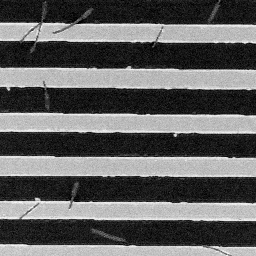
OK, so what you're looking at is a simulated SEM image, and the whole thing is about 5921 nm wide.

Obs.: lines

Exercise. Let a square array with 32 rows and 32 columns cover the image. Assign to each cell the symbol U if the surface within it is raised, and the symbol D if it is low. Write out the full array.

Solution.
DDDDDDDDDDDDDDDDDDDDDDDDDDDDDDDD
DDDDDDDDDDDDDDDDDDDDDDDDDDDDDDDD
DDDDDDDDDDDDDDDDDDDDDDDDDDDDDDDD
UUUUUUUUUUUUUUUUUUUUUUUUUUUUUUUU
UUUUUUUUUUUUUUUUUUUUUUUUUUUUUUUU
DDDDDDDDDDDDDDDDDDDDDDDDDDDDDDDD
DDDDDDDDDDDDDDDDDDDDDDDDDDDDDDDD
DDDDDDDDDDDDDDDDDDDDDDDDDDDDDDDD
DDDDDDDDDDDDDDDDDDDDDDDDDDDDDDDD
UUUUUUUUUUUUUUUUUUUUUUUUUUUUUUUU
UUUUUUUUUUUUUUUUUUUUUUUUUUUUUUUU
DDDDDDDDDDDDDDDDDDDDDDDDDDDDDDDD
DDDDDDDDDDDDDDDDDDDDDDDDDDDDDDDD
DDDDDDDDDDDDDDDDDDDDDDDDDDDDDDDD
UUUUUUUUUUUUUUUUUUUUUUUUUUUUUUUD
UUUUUUUUUUUUUUUUUUUUUUUUUUUUUUUU
DDDDDDDDDDDDDDDDDDDDDDUDUUUUUUUU
DDDDDDDDDDDDDDDDDDDDDDDDDDDDDDDD
DDDDDDDDDDDDDDDDDDDDDDDDDDDDDDDD
DDDDDDDDDDDDDDDDDDDDDDDDDDDDDDDD
UUUUUUUUUUUUUUUUUUUUUUUUUUUUUUUU
UUUUUUUUUUUUUUUUUUUUUUUUUUUUUUUU
DDDDDDDDDDDDDDDDDDDDDDDDDDDDDDDD
DDDDDDDDDDDDDDDDDDDDDDDDDDDDDDDD
DDDDDDDDDDDDDDDDDDDDDDDDDDDDDDDD
UUUUUUUUUUUUUUUUUUUUUUUUUUUUUUUU
UUUUUUUUUUUUUUUUUUUUUUUUUUUUUUUU
DDDDDDDDDDDDDDDDDDDDDDDDDDDUUUUU
DDDDDDDDDDDDDDDDDDDDDDDDDDDDDDDD
DDDDDDDDDDDDDDDDDDDDDDDDDDDDDDDD
DDDDDDDDDDDDDDDDDDDDDDDDDDDDDDDD
UUUUUUUUUUUUUUUUUUUUUUUUUUUUUUUU